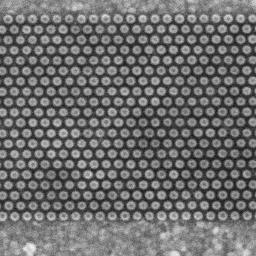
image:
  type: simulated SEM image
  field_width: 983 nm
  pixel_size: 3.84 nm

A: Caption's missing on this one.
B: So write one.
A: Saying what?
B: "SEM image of a regular array of raised bodies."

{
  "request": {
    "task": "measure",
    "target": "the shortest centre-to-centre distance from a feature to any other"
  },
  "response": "44.8 nm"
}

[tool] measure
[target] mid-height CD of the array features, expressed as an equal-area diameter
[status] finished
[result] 0.03 micrometres